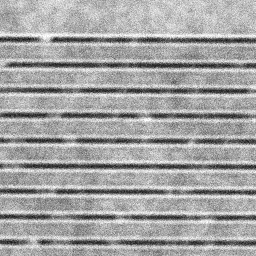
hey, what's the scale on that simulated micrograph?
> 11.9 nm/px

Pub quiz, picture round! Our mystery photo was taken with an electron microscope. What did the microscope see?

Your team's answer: parallel lines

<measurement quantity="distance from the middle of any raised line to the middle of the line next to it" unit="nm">301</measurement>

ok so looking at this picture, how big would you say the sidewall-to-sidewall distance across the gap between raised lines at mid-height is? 193 nm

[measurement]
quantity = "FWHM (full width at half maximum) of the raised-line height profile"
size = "0.108 µm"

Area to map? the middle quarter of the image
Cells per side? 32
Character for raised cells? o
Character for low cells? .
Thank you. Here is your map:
oooooooooooooooooooooooooooooooo
.........................ooooooo
................................
................................
................................
o...............................
oooooooooooooooooooooooooooooooo
oooooooooooooooooooooooooooooooo
................................
................................
................................
................................
oooooooooooooooooooooooooooooooo
oooooooooooooooooooooooooooooooo
................................
................................
................................
................................
oooooooooooooooooooooooooooooooo
oooooooooooooooooooooooooooooooo
................................
................................
................................
................................
................................
oooooooooooooooooooooooooooooooo
oooooooooooooooooooooooooooooooo
................................
................................
................................
................................
oooooooooooooooooooooooooooooooo